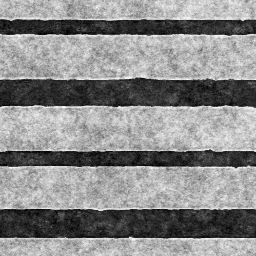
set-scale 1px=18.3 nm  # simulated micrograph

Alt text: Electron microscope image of one or a few lines or trenches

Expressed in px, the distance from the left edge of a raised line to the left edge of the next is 65.3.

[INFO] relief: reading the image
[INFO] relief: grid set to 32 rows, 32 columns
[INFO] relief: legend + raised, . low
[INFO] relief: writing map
++++++++++++++++++++++++++++++++
++++++++++++++++++++++++++++++++
.............+..................
................................
+++++.++.++.++++.....+++++....++
++++++++++++++++++++++++++++++++
++++++++++++++++++++++++++++++++
++++++++++++++++++++++++++++++++
++++++++++++++++++++++++++++++++
++++++++++++++++++++++++++++++++
................................
................................
................................
++++++++++++++.+++++++++++++++++
++++++++++++++++++++++++++++++++
++++++++++++++++++++++++++++++++
++++++++++++++++++++++++++++++++
++++++++++++++++++++++++++++++++
++++++++++++++++++++++++++++++++
................................
................................
++++++++++++++++++++++++++++++++
++++++++++++++++++++++++++++++++
++++++++++++++++++++++++++++++++
++++++++++++++++++++++++++++++++
++++++++++++++++++++++++++++++++
................................
................................
................................
................................
++++++++++++++++++++++++++++++++
++++++++++++++++++++++++++++++++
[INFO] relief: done